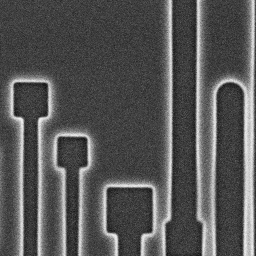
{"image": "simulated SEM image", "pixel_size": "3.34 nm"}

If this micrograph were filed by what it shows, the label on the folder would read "groups of lines, slits or small figures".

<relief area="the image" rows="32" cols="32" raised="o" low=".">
ooooooooooooooooooooo....ooooooo
ooooooooooooooooooooo....ooooooo
ooooooooooooooooooooo....ooooooo
ooooooooooooooooooooo....ooooooo
ooooooooooooooooooooo....ooooooo
ooooooooooooooooooooo....ooooooo
ooooooooooooooooooooo....ooooooo
ooooooooooooooooooooo....ooooooo
ooooooooooooooooooooo....ooooooo
ooooooooooooooooooooo....ooooooo
oo....ooooooooooooooo....ooo..oo
oo....ooooooooooooooo....oo....o
oo....ooooooooooooooo....oo....o
oo....ooooooooooooooo....oo....o
oo....ooooooooooooooo....oo....o
ooo..oooooooooooooooo....oo....o
ooo..oooooooooooooooo....oo....o
ooo..oo....oooooooooo....oo....o
ooo..oo....oooooooooo....oo....o
ooo..oo....oooooooooo....oo....o
ooo..oo....oooooooooo....oo....o
ooo..ooo..ooooooooooo....oo.....
ooo..ooo..ooooooooooo....oo.....
ooo..ooo..ooo......oo....oo.....
ooo..ooo..ooo......oo....oo....o
ooo..ooo..ooo......oo....oo....o
ooo..ooo..ooo......oo....oo....o
ooo..ooo..ooo......oo....oo....o
ooo..ooo..ooo......oo....oo....o
ooo..ooo..oooo....ooo....oo....o
ooo..ooo..ooooo...ooo....oo....o
ooo..ooo..ooooo...ooo....oo....o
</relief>